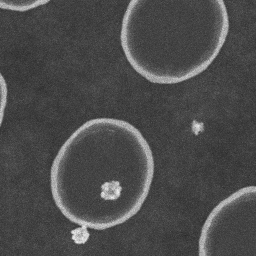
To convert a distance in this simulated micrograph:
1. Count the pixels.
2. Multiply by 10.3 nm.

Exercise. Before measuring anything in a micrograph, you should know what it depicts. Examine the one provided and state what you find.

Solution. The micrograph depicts raised bodies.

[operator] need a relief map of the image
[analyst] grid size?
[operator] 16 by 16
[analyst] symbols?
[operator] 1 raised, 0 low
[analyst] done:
0100000011111100
0000000011111100
0000000011111100
0000000011111000
0000000001110000
0000000000000000
0000000000000000
0000000000000000
0000011110000000
0000111110000000
0001111110000000
0001111110000000
0000111110000011
0000111100000111
0000000000000111
0000000000000111